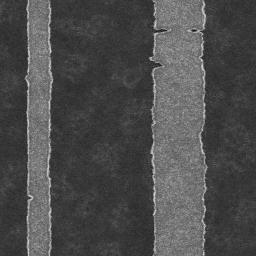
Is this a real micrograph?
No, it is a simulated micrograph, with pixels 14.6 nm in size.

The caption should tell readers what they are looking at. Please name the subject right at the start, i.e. one or a few lines or trenches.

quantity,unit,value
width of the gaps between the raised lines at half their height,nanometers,1530